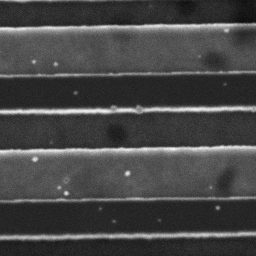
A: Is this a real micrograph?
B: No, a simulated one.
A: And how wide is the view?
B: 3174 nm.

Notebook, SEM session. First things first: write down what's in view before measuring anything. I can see lines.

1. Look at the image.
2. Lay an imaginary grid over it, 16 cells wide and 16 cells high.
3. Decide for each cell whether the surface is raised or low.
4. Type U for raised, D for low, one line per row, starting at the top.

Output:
DDDDDDDDDDDDDDDD
DDDDDDDDDDDDDDDD
UUUUUUUUUUUUUUUU
UUUUUUUUUUUUUUUU
UUUUUUUUUUUUUUUU
UUUUUUUUUUUUUUUU
UUUUUUUUUUUUUUUU
DDDDDDDDDDDDDDDD
DDDDDDDDDDDDDDDD
UUUUUUUUUUUUUUUU
UUUUUUUUUUUUUUUU
UUUUUUUUUUUUUUUU
UUUUUUUUUUUUUUUU
UUUUUUUUUUUUUUUU
UUUUUUUUUUUUUUUU
DDDDDDDDDDDDDDDD